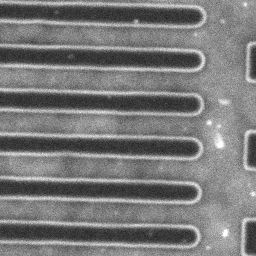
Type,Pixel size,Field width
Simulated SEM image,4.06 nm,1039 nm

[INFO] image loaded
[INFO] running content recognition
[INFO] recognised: groups of lines, slits or small figures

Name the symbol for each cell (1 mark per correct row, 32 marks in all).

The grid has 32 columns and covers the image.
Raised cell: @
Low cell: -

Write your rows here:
@@@@@@@@@@@@@-------------------
@@@@@@@@@@@@@@@@@@@@@@@@@@------
@@@@@@@@@@@@@@@@@@@@@@@@@@------
--------------------------------
--------------------------------
-------------------------------@
@@@@@@@@@@@@@@@@@@@@@@@@@------@
@@@@@@@@@@@@@@@@@@@@@@@@@------@
--------@@@@@@@@@@@@@@@@@------@
-------------------------------@
--------------------------------
@@@@@@@@@@@---------------------
@@@@@@@@@@@@@@@@@@@@@@@@@-------
@@@@@@@@@@@@@@@@@@@@@@@@@-------
--------------------------------
--------------------------------
-------------------------------@
@@@@@@@@@@@@@@@@@@@@@@@@@------@
@@@@@@@@@@@@@@@@@@@@@@@@@------@
-------------@@@@@@@@@@@@------@
-------------------------------@
--------------------------------
@@@@@@@@@@@@--------------------
@@@@@@@@@@@@@@@@@@@@@@@@@-------
@@@@@@@@@@@@@@@@@@@@@@@@@-------
--------------------------------
--------------------------------
-------------------------------@
@@@@@@@@@@@@@@@@@@@@@@@@------@@
@@@@@@@@@@@@@@@@@@@@@@@@@-----@@
----------@@@@@@@@@@@@@@@-----@@
------------------------------@@